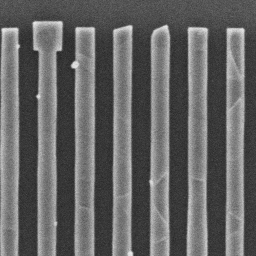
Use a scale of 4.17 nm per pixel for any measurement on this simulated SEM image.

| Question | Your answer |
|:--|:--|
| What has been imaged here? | wiring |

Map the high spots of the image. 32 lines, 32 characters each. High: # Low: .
................................
................................
................................
....####..##...#....#...##......
##..####.###..##...##...##..##..
##..####.###..##...##...##..##..
##...##..###..##...##...##..##..
##...##..###..##...##...##..##..
##...##..###..##...##...##..##..
##...##..###..##...##...##..##..
##...##..###..##...##...##..##..
##...##..###..##...##...##..##..
##...##..###..##...##...##..##..
##...##..###..##...##...##..##..
##...##..###..##...##...##..##..
##...##..###..##...##...##..##..
##...##..###..##...##...##..##..
##...##..###..##...##...##..##..
##...##..###..##...##...##..##..
##...##..###..##...##...##..##..
##...##..###..##...##...##..##..
##...##..###..##...##...##..##..
##...##..###..##...##...##..##..
##...##..###..##...##...##..##..
##...##..###..##...##...##..##..
##...##..###..##...##...##..##..
##...##..###..##...##...##..##..
##...##..###..##...##...##..##..
##...##..###..##...##...##..##..
##...##..###..##...##..###..##..
##...##..###..##...##..###..##..
##...##..###..##...##..###..##..